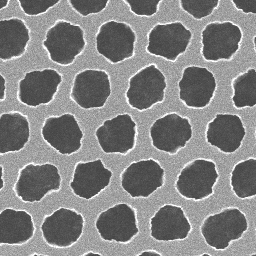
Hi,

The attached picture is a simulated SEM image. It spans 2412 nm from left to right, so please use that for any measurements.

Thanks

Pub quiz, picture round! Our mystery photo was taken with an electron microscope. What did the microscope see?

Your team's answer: a regular array of holes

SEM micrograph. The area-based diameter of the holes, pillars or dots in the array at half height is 363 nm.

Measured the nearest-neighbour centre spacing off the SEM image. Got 489 nm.